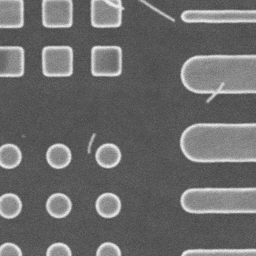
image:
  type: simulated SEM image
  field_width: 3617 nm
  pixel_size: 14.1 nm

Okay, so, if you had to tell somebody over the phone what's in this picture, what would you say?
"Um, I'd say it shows groups of lines, slits or small figures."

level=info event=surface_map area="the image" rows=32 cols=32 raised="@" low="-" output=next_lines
@@@--@@@@--@@@@-----------------
@@@--@@@@--@@@@--------@@@@@@@@@
@@@--@@@@--@@@@--------@@@@@@@@@
--------------------------------
--------------------------------
--------------------------------
@@@--@@@@---@@@-----------------
@@@--@@@@---@@@---------@@@@@@@@
@@@--@@@@---@@@--------@@@@@@@@@
@@---------------------@@@@@@@@@
-----------------------@@@@@@@@@
-------------------------@@@@@@@
--------------------------------
--------------------------------
--------------------------------
--------------------------------
-----------------------@@@@@@@@@
-----------------------@@@@@@@@@
@@----@@-----@@--------@@@@@@@@@
@@@---@@@---@@@--------@@@@@@@@@
@@----@@----@@@-----------------
--------------------------------
--------------------------------
--------------------------------
@@----@@-----@---------@@@@@@@@@
@@@---@@@---@@@--------@@@@@@@@@
@@----@@@---@@@----------@------
--------------------------------
--------------------------------
--------------------------------
-------------@------------------
@@@---@@@---@@@--------@@@@@@@@@